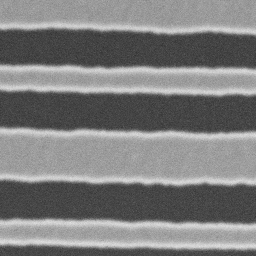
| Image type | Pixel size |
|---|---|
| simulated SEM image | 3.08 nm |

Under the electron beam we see lines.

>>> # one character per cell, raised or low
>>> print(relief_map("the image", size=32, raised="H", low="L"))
HHHHHHHHHHHHHHHHHHHHHHHHHHHHHHHH
HHHHHHHHHHHHHHHHHHHHHHHHHHHHHHHH
HHHHHHHHHHHHHHHHHHHHHHHHHHHHHHHH
HLHHHLLLLHHHHHHHHHHHHHHHHHHHHHHH
LLLLLLLLLLLLLLLLLLLLLLLLLLLLLLLL
LLLLLLLLLLLLLLLLLLLLLLLLLLLLLLLL
LLLLLLLLLLLLLLLLLLLLLLLLLLLLLLLL
LLLLLLLLLLLLLLLLLLLLLLLLLLLLLLLL
HHHHHHHHHHLLLLLLLHLLLLLLLLLLLLLL
HHHHHHHHHHHHHHHHHHHHHHHHHHHHHHHH
HHHHHHHHHHHHHHHHHHHHHHHHHHHHHHHH
LLLLLLLLLLHLLLHLHLLHHHHHHHHHHHHH
LLLLLLLLLLLLLLLLLLLLLLLLLLLLLLLL
LLLLLLLLLLLLLLLLLLLLLLLLLLLLLLLL
LLLLLLLLLLLLLLLLLLLLLLLLLLLLLLLL
LLLLLLLLLLLLLLLLLLLLLLLLLLLLLLLL
HHHHHHHHHHHHHHHHHLLLHHLLLLLLLLLL
HHHHHHHHHHHHHHHHHHHHHHHHHHHHHHHH
HHHHHHHHHHHHHHHHHHHHHHHHHHHHHHHH
HHHHHHHHHHHHHHHHHHHHHHHHHHHHHHHH
HHHHHHHHHHHHHHHHHHHHHHHHHHHHHHHH
HHHHHHHHHHHHHHHHHHHHHHHHHHHHHHHH
LLHHHLLHHHHHHHHHHHHHHHHHHHHHHHHH
LLLLLLLLLLLLLLLLLLLLLLLLLLLLLLLL
LLLLLLLLLLLLLLLLLLLLLLLLLLLLLLLL
LLLLLLLLLLLLLLLLLLLLLLLLLLLLLLLL
LLLLLLLLLLLLLLLLLLLLLLLLLLLLLLLL
LLLLLLLLLLLLLLLLLLLLLLLLLLLLLLLL
HHHHHHHHHHHHHHHHHHHHHHHHHHHHHHHH
HHHHHHHHHHHHHHHHHHHHHHHHHHHHHHHH
LLHLLLHHHHHHHHHHHHHHHHHHHHHHHHHH
LLLLLLLLLLLLLLLLLLLLLLLLLLLLLLLL